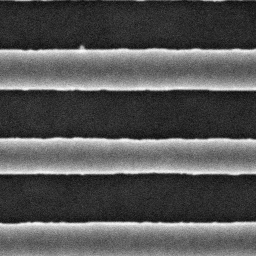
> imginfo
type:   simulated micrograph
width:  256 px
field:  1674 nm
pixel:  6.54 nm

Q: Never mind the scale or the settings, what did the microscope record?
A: lines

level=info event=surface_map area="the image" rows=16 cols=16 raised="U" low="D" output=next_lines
DDDDDDDDDDDDDDDD
DDDDDDDDDDDDDDDD
DDDDDDDDDDDDDDDD
UUUUUUUUUUUUUUUU
UUUUUUUUUUUUUUUU
UUUUUUUUUUUUUUUU
DDDDDDDDDDDDDDDD
DDDDDDDDDDDDDDDD
DDDDDDDDDDDDDDDD
UUUUUUUUUUUUUUUU
UUUUUUUUUUUUUUUU
DDDDDDDDDDDDDDDD
DDDDDDDDDDDDDDDD
DDDDDDDDDDDDDDDD
UUUUUUUUUUUUUUUU
UUUUUUUUUUUUUUUU